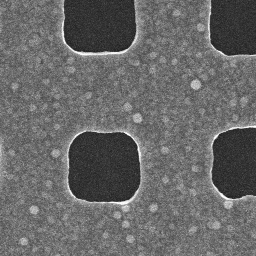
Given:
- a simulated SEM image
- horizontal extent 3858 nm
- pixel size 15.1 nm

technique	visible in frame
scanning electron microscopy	holes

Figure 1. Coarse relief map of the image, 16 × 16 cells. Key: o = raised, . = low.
oooo....ooooo...
oooo.....oooo...
oooo....ooooo...
oooooooooooooooo
oooooooooooooooo
oooooooooooooooo
oooooooooooooooo
oooooooooooooooo
ooooo...oooooo..
oooo.....oooo...
oooo.....oooo...
oooo.....oooo...
ooooo...oooooooo
oooooooooooooooo
oooooooooooooooo
oooooooooooooooo